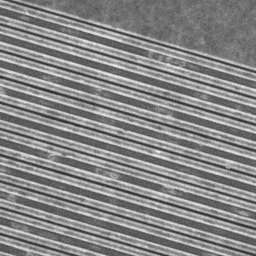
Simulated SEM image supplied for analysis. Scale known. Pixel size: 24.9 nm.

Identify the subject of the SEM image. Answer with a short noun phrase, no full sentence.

parallel lines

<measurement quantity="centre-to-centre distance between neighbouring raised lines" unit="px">12.6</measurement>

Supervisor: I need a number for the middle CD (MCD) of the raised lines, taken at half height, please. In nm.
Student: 132